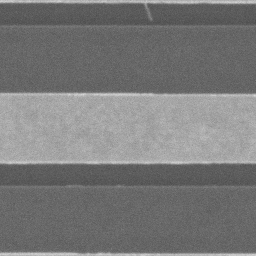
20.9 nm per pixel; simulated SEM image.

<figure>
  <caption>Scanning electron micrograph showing lines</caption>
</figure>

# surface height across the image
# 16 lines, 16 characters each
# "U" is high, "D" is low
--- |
DDDDDDDDDDDDDDDD
DDDDDDDDDDDDDDDD
DDDDDDDDDDDDDDDD
DDDDDDDDDDDDDDDD
DDDDDDDDDDDDDDDD
DDDDDDDDDDDDDDDD
UUUUUUUUUUUUUUUU
UUUUUUUUUUUUUUUU
UUUUUUUUUUUUUUUU
UUUUUUUUUUUUUUUU
DDDDDDDDDDDDDDDD
DDDDDDDDDDDDDDDD
DDDDDDDDDDDDDDDD
DDDDDDDDDDDDDDDD
DDDDDDDDDDDDDDDD
DDDDDDDDDDDDDDDD